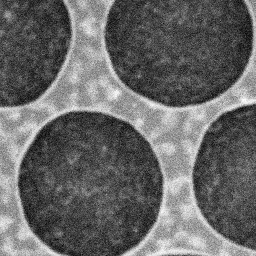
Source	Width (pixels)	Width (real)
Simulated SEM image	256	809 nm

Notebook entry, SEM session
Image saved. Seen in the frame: holes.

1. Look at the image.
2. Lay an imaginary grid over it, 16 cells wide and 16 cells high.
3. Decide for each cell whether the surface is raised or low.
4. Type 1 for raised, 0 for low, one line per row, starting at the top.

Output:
0000111000000000
0000111000000000
0000011000000000
0000111000000000
0000111000000001
0001111100000011
0011111111000111
1110000011111000
1100000001111000
1000000000110000
1000000000110000
1000000000110000
1000000000110000
1000000000111000
1100000001111000
1110000011111110